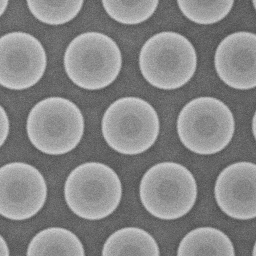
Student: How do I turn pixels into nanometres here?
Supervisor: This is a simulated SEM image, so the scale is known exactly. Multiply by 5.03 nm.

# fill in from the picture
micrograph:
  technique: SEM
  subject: an array of small figures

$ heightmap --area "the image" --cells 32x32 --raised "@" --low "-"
@--@@@@@@@---@@@@@@@--@@@@@@@---
----@@@@@@---@@@@@@----@@@@@@---
-----@@@@------@@@------@@@-----
--------------------------------
@@@@------@@@------@@@@------@@@
@@@@@----@@@@@----@@@@@@----@@@@
@@@@@@--@@@@@@@---@@@@@@---@@@@@
@@@@@@--@@@@@@@--@@@@@@@---@@@@@
@@@@@@--@@@@@@@---@@@@@@---@@@@@
@@@@@----@@@@@@---@@@@@@---@@@@@
@@@@------@@@@-----@@@@-----@@@@
--------------------------------
-----@@@-------@@@------@@@-----
----@@@@@@----@@@@@----@@@@@----
@---@@@@@@---@@@@@@@--@@@@@@@---
@--@@@@@@@---@@@@@@@--@@@@@@@---
@--@@@@@@@---@@@@@@@--@@@@@@@---
@---@@@@@@---@@@@@@----@@@@@@---
-----@@@@-----@@@@@-----@@@@----
--------------------------------
-@@--------@@-------@@-------@@@
@@@@@----@@@@@----@@@@@@----@@@@
@@@@@---@@@@@@@---@@@@@@---@@@@@
@@@@@@--@@@@@@@---@@@@@@@--@@@@@
@@@@@@--@@@@@@@---@@@@@@---@@@@@
@@@@@---@@@@@@@---@@@@@@---@@@@@
@@@@@----@@@@@-----@@@@-----@@@@
--------------------------------
----------------@---------------
----@@@@@-----@@@@@----@@@@@----
@---@@@@@@---@@@@@@@---@@@@@@---
@--@@@@@@@---@@@@@@@--@@@@@@@---